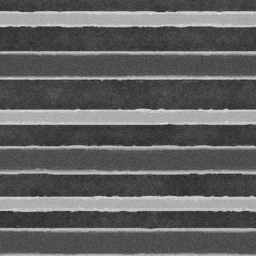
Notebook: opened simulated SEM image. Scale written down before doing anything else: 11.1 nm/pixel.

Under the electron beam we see lines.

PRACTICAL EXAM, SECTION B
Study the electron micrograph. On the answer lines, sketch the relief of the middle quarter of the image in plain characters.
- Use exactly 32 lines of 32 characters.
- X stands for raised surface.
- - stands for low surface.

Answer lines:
XXXXXXXXXXXXXXXXXXXXXXXXXXXXXXXX
XXXXXXXXXXXXXXXXXXXXXXXXXXXXXXXX
XXXXXXXXXXXXXXXXXXXXXXXXXXXXXXXX
-XXXXXXXXXXXXXXX-X--------------
--------------------------------
--------------------------------
--------------------------------
--------------------------------
--------------------------------
--------------------------------
--------------------------------
--------------------------------
XXXXXXXXXXXXXXXXXXXXXXXXXXXXXXXX
XXXXXXXXXXXXXXXXXXXXXXXXXXXXXXXX
XXXXXXXXXXXXXXXXXXXXXXXXXXXXXXXX
--------------------------------
--------------------------------
--------------------------------
--------------------------------
--------------------------------
--------------------------------
XXXXXXXXXXXXXXXXXXXXXXXXXXXXXXXX
XXXXXXXXXXXXXXXXXXXXXXXXXXXXXXXX
XXXXXXXXXXXXXXXXXXXXXXXXXXXXXXXX
XXXXXXXXXXXXXXXXXXXXXXXXXXXXXXXX
XXXXXXXXXXXXXXXXXXXXXXXXXXXXXXXX
XXXXXXXXXXXXXXXXXXXXXXXXXXXXXXXX
--------------------------------
--------------------------------
--------------------------------
--------------------------------
--------------------------------